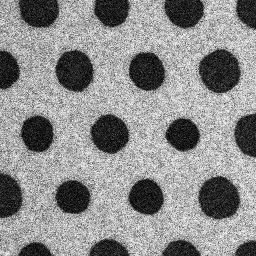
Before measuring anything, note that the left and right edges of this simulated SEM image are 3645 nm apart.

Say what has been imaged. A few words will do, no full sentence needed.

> a regular array of holes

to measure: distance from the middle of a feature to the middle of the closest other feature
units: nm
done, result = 1030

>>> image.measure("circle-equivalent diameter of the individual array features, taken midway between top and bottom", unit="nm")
539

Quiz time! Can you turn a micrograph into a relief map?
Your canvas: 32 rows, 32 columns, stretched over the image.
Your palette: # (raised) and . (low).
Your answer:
##.....#####....#####....#####..
##.....#####....#####....#####..
###....#####....#####....#####..
#####.#################.#######.
################################
################################
.#######..################...###
..#####....#####....#####.....##
..#####.....####.....####.....##
..#####.....####.....####.....##
..######...######...#####.....##
###########################.####
################################
################################
####.########.################..
###...######....#####...######..
###....####.....#####....####...
###....#####....#####....####...
###...######...#######..######..
###############################.
################################
################################
..###############..#######...###
...####....#####....#####.....##
...####....#####....#####.....##
...####....#####....#####.....##
..######..#######...#####.....##
################################
################################
################################
####.#######...######...######..
##....#####.....####.....####...